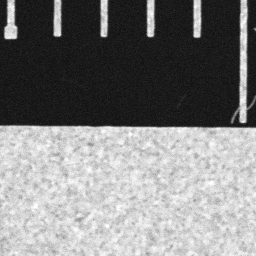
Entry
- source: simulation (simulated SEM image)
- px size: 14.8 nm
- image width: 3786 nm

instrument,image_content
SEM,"wiring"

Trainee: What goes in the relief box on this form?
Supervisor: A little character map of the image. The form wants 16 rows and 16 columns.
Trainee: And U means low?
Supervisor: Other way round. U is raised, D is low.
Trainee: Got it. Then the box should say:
DDDDDDDDDDDDDDDD
DDDDDDDDDDDDDDDD
DDDDDDDDDDDDDDDD
DDDDDDDDDDDDDDDD
DDDDDDDDDDDDDDDD
DDDDDDDDDDDDDDDD
DDDDDDDDDDDDDDDD
DDDDDDDDDDDDDDDD
UUUUUUUUUUUUUUUU
UUUUUUUUUUUUUUUU
UUUUUUUUUUUUUUUU
UUUUUUUUUUUUUUUU
UUUUUUUUUUUUUUUU
UUUUUUUUUUUUUUUU
UUUUUUUUUUUUUUUU
UUUUUUUUUUUUUUUU